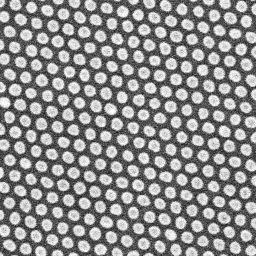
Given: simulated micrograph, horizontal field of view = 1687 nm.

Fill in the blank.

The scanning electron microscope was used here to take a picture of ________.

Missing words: a regular array of raised bodies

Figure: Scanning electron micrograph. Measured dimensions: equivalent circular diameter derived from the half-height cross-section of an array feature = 70.1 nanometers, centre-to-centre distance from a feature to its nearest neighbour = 104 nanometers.